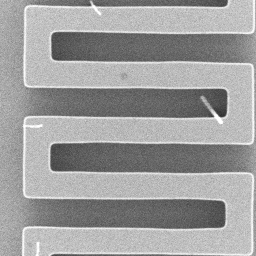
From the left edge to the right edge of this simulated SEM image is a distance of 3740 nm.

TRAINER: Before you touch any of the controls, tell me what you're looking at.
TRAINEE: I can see groups of lines, slits or small figures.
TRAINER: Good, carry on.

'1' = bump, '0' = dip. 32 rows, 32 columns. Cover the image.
00000000000000000000000000001111
00011111111111111111111111111111
00011111111111111111111111111111
00011111111111111111111111111111
00011100000000000000000000000000
00011100000000000000000000000000
00011100000000000000000000000000
00011110000000000000000000000000
00011111111111111111111111111111
00011111111111111111111111111111
00011111111111111111111111111111
00000000000000000000000000001111
00000000000000000000000000000111
00000000000000000000000000001111
00000000000000000000000000001111
00011111111111111111111111111111
00011111111111111111111111111111
00011111111111111111111111111111
00011100000000000000000000000000
00011100000000000000000000000000
00011100000000000000000000000000
00011110000000000000000000000000
00011111111111111111111111111111
00011111111111111111111111111111
00011111111111111111111111111111
00000000000000000000000000001111
00000000000000000000000000001110
00000000000000000000000000001110
00011111111111100000000000011111
00011111111111111111111111111111
00011111111111111111111111111111
00011111111111111111111111111110